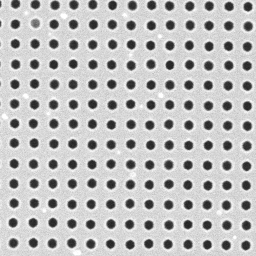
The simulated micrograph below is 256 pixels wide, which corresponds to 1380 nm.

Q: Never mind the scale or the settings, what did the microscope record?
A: a regular array of holes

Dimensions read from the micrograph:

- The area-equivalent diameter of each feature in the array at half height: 50.9 nanometers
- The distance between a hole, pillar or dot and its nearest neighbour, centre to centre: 102 nm